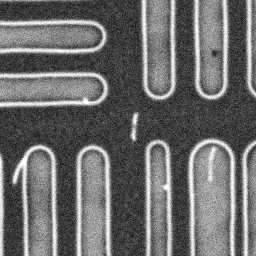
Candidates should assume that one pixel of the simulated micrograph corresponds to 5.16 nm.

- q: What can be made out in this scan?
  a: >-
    groups of lines, slits or small figures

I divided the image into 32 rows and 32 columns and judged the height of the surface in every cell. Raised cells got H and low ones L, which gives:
HHHHHHHHHHHHHHHHHHLLLLHHHLLLHHHL
HHHHHHHHHHHHHHHHHHLLLLHHHLLLHHHL
HHHHHHHHHHHHHHHHHHLLLHHHHLLLHHHL
LLLLLLLLLLLLHHHHHHLLLHHHHLLLHHHL
LLLLLLLLLLLLLHHHHHLLLHHHHLLLHHHL
LLLLLLLLLLLLLHHHHHLLLHHHHLLLHHHL
HHHHHHHHHHHHHHHHHHLLLLHHHLLLHHHL
HHHHHHHHHHHHHHHHHHLLLLHHHLLLHHHL
HHHHHHHHHHHHHHHHHHLLLLHHHLLLHHHL
LHHLLLLLLLLLHHHHHHLLLLHHHLLLHHHL
LLLLLLLLLLLLLHHHHHLLLHHHHLLLHHHL
LLLLLLLLLLLLLHHHHHHLLHHHHLLLHHHH
LLLLLLLLLLLLHHHHHHHHHHHHHHHHHHHH
HHHHHHHHHHHHHHHHHHHHHHHHHHHHHHHH
HHHHHHHHHHHHHHHHHHHHHHHHHHHHHHHH
HHHHHHHHHHHHHHHHHHHHHHHHHHHHHHHH
HHHHHHHHHHHHHHHHHHHHHHHHHHHHHHHH
HHHHHHHHHHHHHHHHHHHHHHHHHHHHHHHH
HHHHHHHHHHHHHHHHHHHLLHHHHLLLHHHL
HHHLLLHHHHLLLHHHHHHLLHHHLLLLLHHL
HHHLLLLHHHLLLHHHHHHLLHHHLLLLLHHL
HHHLLLLHHHLLLHHHHHHLLHHHLLLLLHHL
HHHLLLLHHHLLLHHHHHHLLHHHLLLLLHHL
HHHLLLLHHHLLLHHHHHHLLHHHLLLLLHHL
HHHLLLLHHHLLLHHHHHHLLHHHLLLLLHHL
HHHLLLLHHHLLLHHHHHHLLHHHLLLLLHHL
HHHLLLLHHHLLLHHHHHHLLHHHLLLLLHHL
HHHLLLLHHHLLLHHHHHHLLHHHLLLLLHHL
HHHLLLLHHHLLLHHHHHHLLHHHLLLLLHHL
HHHLLLLHHHLLLHHHHHHLLHHHLLLLLHHL
HHHLLLLHHHLLLHHHHHHLLHHHLLLLLHHL
HHHLLLLHHHLLLHHHHHHLLHHHLLLLLHHL